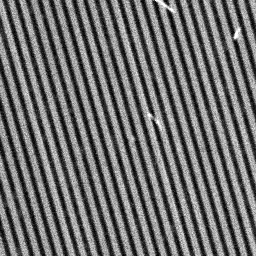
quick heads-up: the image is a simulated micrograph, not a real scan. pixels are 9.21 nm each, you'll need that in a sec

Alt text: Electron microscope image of parallel lines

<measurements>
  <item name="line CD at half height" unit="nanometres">47.6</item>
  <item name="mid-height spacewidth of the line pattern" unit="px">6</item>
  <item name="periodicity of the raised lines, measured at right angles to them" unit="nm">102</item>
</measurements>